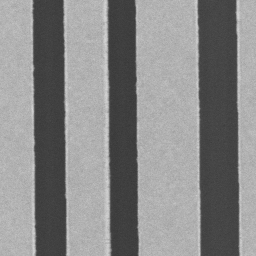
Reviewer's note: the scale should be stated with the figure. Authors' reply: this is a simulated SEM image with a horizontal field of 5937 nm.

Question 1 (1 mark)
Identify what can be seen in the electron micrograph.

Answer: lines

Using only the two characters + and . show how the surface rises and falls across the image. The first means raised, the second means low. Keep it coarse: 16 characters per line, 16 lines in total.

++..+++.++++...+
++..+++..+++...+
++..+++..+++...+
++..+++..+++...+
++..+++..+++...+
++..+++..+++...+
++..+++..+++...+
++..+++..+++...+
++..+++..+++...+
++..+++..+++...+
++..+++..+++...+
++..+++..+++...+
++..+++..+++...+
++..+++..+++...+
++..+++..+++...+
++..+++..+++...+